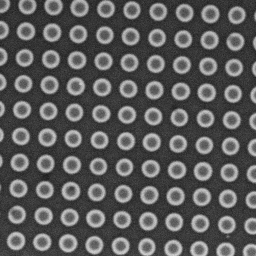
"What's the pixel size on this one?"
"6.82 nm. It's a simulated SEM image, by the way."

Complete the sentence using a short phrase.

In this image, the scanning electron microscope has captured an array of small figures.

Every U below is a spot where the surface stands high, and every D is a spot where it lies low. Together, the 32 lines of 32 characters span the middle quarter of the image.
DDUUUDDDUUUUDDUUUUDDDUUUUDDUUUUU
DDDDDDDDDDDDDDDUUDDDDUUUUDDDUUUD
DDDDDDDDDDDDDDDDDDDDDDDDDDDDDDDD
DDUUDDDDDDDDDDDDDDDDDDDDDDDDDDDD
DUUUUDDDUUUDDDDUUDDDDDUDDDDDDDDD
DUUUUDDUUUUUDDUUUUDDDUUUUDDUUUUD
DUUUUDDUUUUUDDUUUUDDDUUUUDDUUUUD
DDUUDDDDUUUDDDUUUUDDDUUUUDDUUUUD
DDDDDDDDDDDDDDDDDDDDDUUDDDDDUUDD
DDDDDDDDDDDDDDDDDDDDDDDDDDDDDDDD
DUUUDDDDUUDDDDDDDDDDDDDDDDDDDDDD
DUUUUDDUUUUDDDUUUUDDDUUUDDDDUUDD
DUUUUDDUUUUDDDUUUUDDUUUUDDDUUUUD
DUUUDDDUUUUDDDUUUUDDUUUUDDDUUUUD
DDDDDDDDDDDDDDDUUDDDDUUUDDDUUUUD
DDDDDDDDDDDDDDDDDDDDDDDDDDDDDDDD
DDDDDDDDDDDDDDDDDDDDDDDDDDDDDDDD
DUUUDDDDUUDDDDUUUDDDDUDDDDDDDDDD
UUUUDDDUUUUDDDUUUDDDUUUUDDDUUUDD
UUUUDDDUUUUDDUUUUUDDUUUUDDDUUUUD
DUUDDDDUUUDDDDUUUDDDUUUUDDDUUUUD
DDDDDDDDDDDDDDDDDDDDDUUDDDDUUUDD
DDDDDDDDDDDDDDDDDDDDDDDDDDDDDDDD
DUUDDDDDDDDDDDDDDDDDDDDDDDDDDDDD
UUUUDDDUUUDDDDUUUDDDUUUDDDDDUDDD
UUUUDDDUUUUDDUUUUDDDUUUUDDUUUUDD
UUUUDDDUUUDDDUUUUDDDUUUUDDUUUUDD
DDDDDDDDUDDDDDUUDDDDUUUDDDUUUUDD
DDDDDDDDDDDDDDDDDDDDDDDDDDDUUDDD
DDDDDDDDDDDDDDDDDDDDDDDDDDDDDDDD
UUUUDDDUUUDDDDUUDDDDDDDDDDDDDDDD
UUUUDDUUUUDDDUUUUDDDUUUDDDUUUDDD